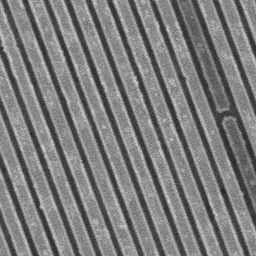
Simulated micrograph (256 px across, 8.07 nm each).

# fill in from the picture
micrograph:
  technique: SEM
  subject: parallel lines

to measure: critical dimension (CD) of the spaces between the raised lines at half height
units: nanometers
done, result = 53.9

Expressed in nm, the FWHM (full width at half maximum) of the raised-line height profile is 106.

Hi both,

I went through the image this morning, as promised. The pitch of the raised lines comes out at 160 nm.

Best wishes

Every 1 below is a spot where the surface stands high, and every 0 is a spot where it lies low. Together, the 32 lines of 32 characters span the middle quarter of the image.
10011100111001111001110011100111
10011100111100111001110011110111
10011110011100111101111001110011
11001110011100111100111001110001
11001110011110011100111001111001
11100111001110011100111100111001
11100111001110001110011100111001
11100111100111001110011100111100
11110011100111001111001110011100
01110011100111100111001110011100
01110011110011100111001111001110
00111001110011100111100111001110
00111001110011110011100111001111
00111100111001110011100111101111
10111100111001110011110011100111
10011100111100111001110011100111
10011110011100111001110001110011
11001110011100111100111001110011
11001110011110011100111001110001
11101111001110011100111100111001
11100111001110011110011100111001
11100111100111001110011100111100
11110011100111001111011110011100
01110011100111100111001110011100
01110011110011100111001110011110
00111001110011100111100111001110
00111001110011110011100111001110
00111000111001110011100111100111
10011100111001110011110011100111
10011100111101111001110011100111
10011110111100111001110011110011
11001110011100111100111001110011